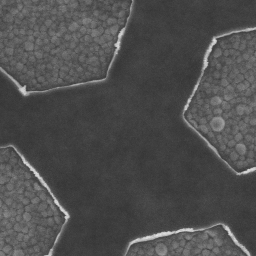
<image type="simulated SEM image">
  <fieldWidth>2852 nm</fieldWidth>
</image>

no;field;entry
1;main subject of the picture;holes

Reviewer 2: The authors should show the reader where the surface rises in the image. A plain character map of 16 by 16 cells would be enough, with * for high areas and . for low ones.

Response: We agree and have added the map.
........********
........********
.......*******..
.......******...
.......******...
**.*********....
************....
************....
*************...
.*************..
..*************.
...*************
...*************
....************
....*******...**
...*****.......*